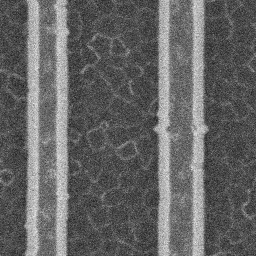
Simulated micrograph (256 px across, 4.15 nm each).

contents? one or a few lines or trenches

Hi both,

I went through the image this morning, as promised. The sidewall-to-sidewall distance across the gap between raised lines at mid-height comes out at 422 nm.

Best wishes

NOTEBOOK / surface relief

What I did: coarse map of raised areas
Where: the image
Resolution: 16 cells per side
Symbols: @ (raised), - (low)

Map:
--@@------@@----
--@@------@@----
--@@------@@----
--@@------@@----
--@@------@@----
--@@------@@----
--@@------@@----
--@@------@@----
--@@------@@----
--@@------@@----
--@@------@@----
--@@------@@----
--@@------@@----
--@@------@@----
--@@------@@----
--@@------@@----